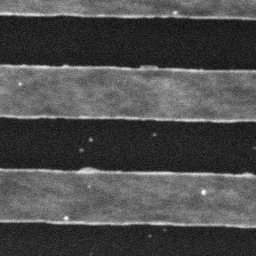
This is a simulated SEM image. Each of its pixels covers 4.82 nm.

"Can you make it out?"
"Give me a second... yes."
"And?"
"lines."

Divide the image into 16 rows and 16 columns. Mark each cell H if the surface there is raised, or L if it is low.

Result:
HHHHHHHHHHHHHHHH
LLLLLLLLLLLLLLLL
LLLLLLLLLLLLLLLL
LLLLLLLLLLLLLLLL
HHHHHHHHHHHHHHHH
HHHHHHHHHHHHHHHH
HHHHHHHHHHHHHHHH
LLLLLLLLLLLHHHHH
LLLLLLLLLLLLLLLL
LLLLLLLLLLLLLLLL
LLLLLLLLLLLLLLLL
HHHHHHHHHHHHHHHH
HHHHHHHHHHHHHHHH
HHHHHHHHHHHHHHHH
LLLLLLLLLLLLLLLL
LLLLLLLLLLLLLLLL